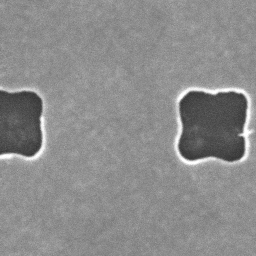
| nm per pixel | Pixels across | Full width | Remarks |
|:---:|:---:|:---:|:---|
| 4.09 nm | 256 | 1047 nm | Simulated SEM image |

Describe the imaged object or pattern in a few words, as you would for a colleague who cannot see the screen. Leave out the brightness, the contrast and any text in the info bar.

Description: holes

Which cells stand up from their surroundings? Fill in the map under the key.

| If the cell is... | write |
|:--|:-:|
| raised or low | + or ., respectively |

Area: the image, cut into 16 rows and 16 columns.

++++++++++++++++
++++++++++++++++
++++++++++++++++
++++++++++++++++
++++++++++++++++
++++++++++++++++
...++++++++....+
...++++++++....+
...++++++++....+
..+++++++++....+
++++++++++++++++
++++++++++++++++
++++++++++++++++
++++++++++++++++
++++++++++++++++
++++++++++++++++